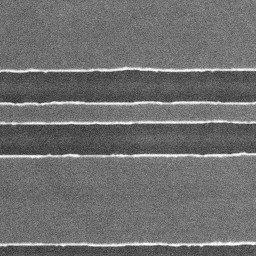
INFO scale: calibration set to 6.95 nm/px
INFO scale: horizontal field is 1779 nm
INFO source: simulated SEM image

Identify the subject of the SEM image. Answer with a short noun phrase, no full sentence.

lines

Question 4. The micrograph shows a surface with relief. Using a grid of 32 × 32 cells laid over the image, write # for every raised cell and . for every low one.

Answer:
################################
################################
################################
################################
################################
################################
################################
################################
################################
................................
................................
................................
................................
################################
################################
................................
................................
................................
................................
################################
################################
################################
################################
################################
################################
################################
################################
################################
################################
################################
#############################...
................................